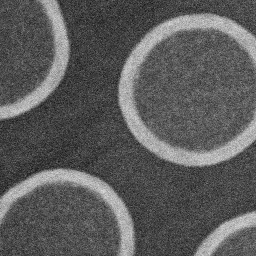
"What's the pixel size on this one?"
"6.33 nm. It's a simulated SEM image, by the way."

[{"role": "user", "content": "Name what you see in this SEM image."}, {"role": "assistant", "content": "raised bodies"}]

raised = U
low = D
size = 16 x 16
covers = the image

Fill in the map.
UUUDDDDDDDDDDDDD
UUUUDDDDDDDUUUDD
UUUUDDDDDDUUUUUD
UUUUDDDDDUUUUUUU
UUUDDDDDUUUUUUUU
UUUDDDDDUUUUUUUU
UUDDDDDDUUUUUUUU
DDDDDDDDUUUUUUUU
DDDDDDDDDUUUUUUD
DDDDDDDDDDDUUUDD
DDDDDDDDDDDDDDDD
DDUUUUDDDDDDDDDD
DUUUUUUDDDDDDDDD
UUUUUUUUDDDDDDDD
UUUUUUUUDDDDDDUU
UUUUUUUUDDDDDUUU